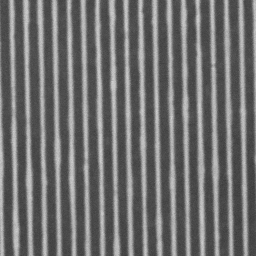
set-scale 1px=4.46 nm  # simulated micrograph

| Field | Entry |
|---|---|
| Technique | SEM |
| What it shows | parallel lines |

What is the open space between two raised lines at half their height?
48.5 nm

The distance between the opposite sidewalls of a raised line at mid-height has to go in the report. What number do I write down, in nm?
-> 17.3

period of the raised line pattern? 14.3 pixels